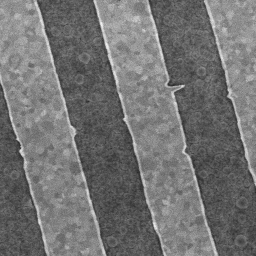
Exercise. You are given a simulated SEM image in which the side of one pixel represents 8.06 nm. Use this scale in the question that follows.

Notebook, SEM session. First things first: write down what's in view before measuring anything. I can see one or a few lines or trenches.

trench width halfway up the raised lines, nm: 454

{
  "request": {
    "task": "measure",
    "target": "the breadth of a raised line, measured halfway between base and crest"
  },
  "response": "414 nm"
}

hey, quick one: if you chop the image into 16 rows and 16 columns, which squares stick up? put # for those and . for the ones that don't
##....###....###
###...####...###
###....###....##
###....###....##
###....###....##
####...####...##
####....###....#
.###....###....#
.####...###....#
.####...####...#
..###....###....
..###....###....
..####...####...
..####....###...
...###....###...
...####...###...